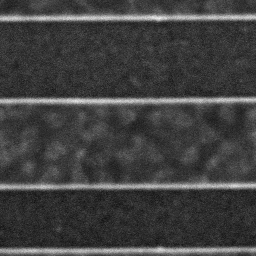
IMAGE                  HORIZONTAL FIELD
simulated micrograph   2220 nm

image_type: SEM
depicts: one or a few lines or trenches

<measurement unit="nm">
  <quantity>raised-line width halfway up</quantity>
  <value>754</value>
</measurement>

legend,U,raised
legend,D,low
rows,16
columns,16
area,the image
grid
UUUUUUUUUUUUUUUU
DDDDDDDDDDDDDDDD
DDDDDDDDDDDDDDDD
DDDDDDDDDDDDDDDD
DDDDDDDDDDDDDDDD
DDDDDDDDDDDDDDDD
UUUUUUUUUUUUUUUU
UUUUUUUUUUUUUUUU
UUUUUUUUUUUUUUUU
UUUUUUUUUUUUUUUU
UUUUUUUUUUUUUUUU
UUUUUUUUUUUUUUUU
DDDDDDDDDDDDDDDD
DDDDDDDDDDDDDDDD
DDDDDDDDDDDDDDDD
DDDDDDDDDDDDDDDD